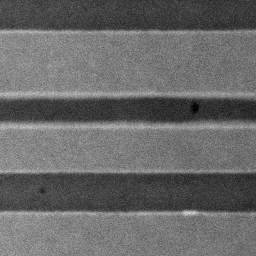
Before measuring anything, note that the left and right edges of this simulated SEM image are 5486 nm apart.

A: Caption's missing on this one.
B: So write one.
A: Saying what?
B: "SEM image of lines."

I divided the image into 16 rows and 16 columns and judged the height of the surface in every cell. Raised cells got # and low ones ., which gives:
................
................
################
################
################
################
................
................
################
################
################
................
................
################
################
################